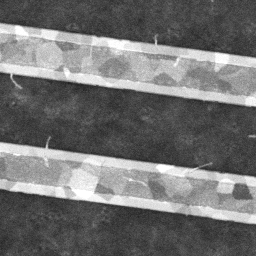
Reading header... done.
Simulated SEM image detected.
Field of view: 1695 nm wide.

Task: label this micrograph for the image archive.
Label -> one or a few lines or trenches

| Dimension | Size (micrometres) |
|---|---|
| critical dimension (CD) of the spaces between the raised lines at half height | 0.516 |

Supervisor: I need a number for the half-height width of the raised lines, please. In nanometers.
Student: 255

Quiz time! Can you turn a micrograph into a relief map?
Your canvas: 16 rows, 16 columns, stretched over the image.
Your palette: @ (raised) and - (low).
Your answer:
----------------
----------------
@@@@@-----------
@@@@@@@@@@@@@---
--@@@@@@@@@@@@@@
---------@@@@@@@
----------------
----------------
----------------
@@@-------------
@@@@@@@@@-------
@@@@@@@@@@@@@@@@
-------@@@@@@@@@
--------------@@
----------------
----------------